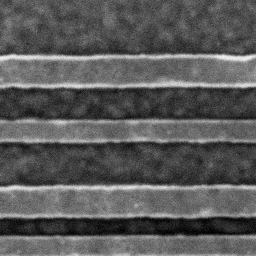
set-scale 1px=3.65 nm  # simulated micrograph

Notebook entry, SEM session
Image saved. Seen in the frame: lines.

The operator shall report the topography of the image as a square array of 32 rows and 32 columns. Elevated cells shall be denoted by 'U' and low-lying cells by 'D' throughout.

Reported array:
DDDDDDDDDDDDDDDDDDDDDDDDDDDDDDDD
DDDDDDDDDDDDDDDDDDDDDDDDDDDDDDDD
DDDDDDDDDDDDDDDDDDDDDDDDDDDDDDDD
DDDDDDDDDDDDDDDDDDDDDDDDDDDDDDDD
DDDDDDDDDDDDDDDDDDDDDDDDDDDDDDDD
DDDDDDDDDDDDDDDDDDDDDDDDDDDDDDDD
DDDDDDDDDDDDDDDDDDDDDDDDDDDDDDDD
UUUUUUUUUUUUUUUUUUUUUUUUUUUUUUUU
UUUUUUUUUUUUUUUUUUUUUUUUUUUUUUUU
UUUUUUUUUUUUUUUUUUUUUUUUUUUUUUUU
UUUUUUUUUUUUUUUUUUUUUUUUUUUUUUUU
DDDDDDDDDDDDDDDDDDDDDDDDDDDDDDDD
DDDDDDDDDDDDDDDDDDDDDDDDDDDDDDDD
DDDDDDDDDDDDDDDDDDDDDDDDDDDDDDDD
DDDDDDDDDDDDDDDDDDDDDDDDDDDDDDDD
UUUUUUUUUUUUUUUUUUUUUUUUUUUUUUUU
UUUUUUUUUUUUUUUUUUUUUUUUUUUUUUUU
UUUUUUUUUUUUUUUUUUUUUUUUUUUUUUUU
DDDDDDDDDDDDDDDDDDDDDDDDDDDDDDDD
DDDDDDDDDDDDDDDDDDDDDDDDDDDDDDDD
DDDDDDDDDDDDDDDDDDDDDDDDDDDDDDDD
DDDDDDDDDDDDDDDDDDDDDDDDDDDDDDDD
DDDDDDDDDDDDDDDDDDDDDDDDDDDDDDDD
DUUUUUUUUUUUUUUUUUUUUUUUUUUUUUUU
UUUUUUUUUUUUUUUUUUUUUUUUUUUUUUUU
UUUUUUUUUUUUUUUUUUUUUUUUUUUUUUUU
UUUUUUUUUUUUUUUUUUUUUUUUUUUUUUUU
DDDDDDDDDDDDDDDDDDDDDDDDDDDDDDDD
DDDDDDDDDDDDDDDDDDDDDDDDDDDDDDDD
DDDDDDDUDDDDDDDDUUUUDDUDUUUUUUUU
UUUUUUUUUUUUUUUUUUUUUUUUUUUUUUUU
UUUUUUUUUUUUUUUUUUUUUUUUUUUUUUUU